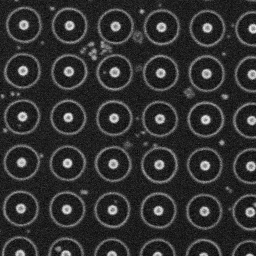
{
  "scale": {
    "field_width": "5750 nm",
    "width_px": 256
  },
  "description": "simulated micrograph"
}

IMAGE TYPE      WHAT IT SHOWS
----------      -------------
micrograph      an array of small figures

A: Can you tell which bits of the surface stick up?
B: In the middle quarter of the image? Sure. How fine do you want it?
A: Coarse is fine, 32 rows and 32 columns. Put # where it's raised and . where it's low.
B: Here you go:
.....####.......####........####
##...####...##...###...##...####
##...###....##...###...##...###.
.....####........###........####
....#####.......#####.......####
...#######.....#######.....#####
################################
################################
################################
..#########.####################
....######.....######.....######
.....####.......####.......#####
.....####.......####........####
##...###....#....###...##...###.
.....####........###...##...###.
.....####.......####........####
....######.....######......#####
############..########....######
################################
################################
################################
...#######....########....######
....#####......######......#####
.....###........####........####
##...###....#...####...##...###.
#....###...##...####...##...###.
....#####.......####........###.
....#####.......####.......#####
...#######....#######.....######
#######################.########
################################
################################